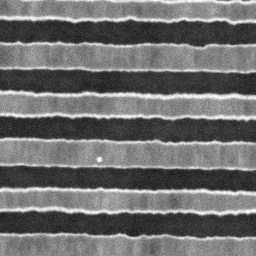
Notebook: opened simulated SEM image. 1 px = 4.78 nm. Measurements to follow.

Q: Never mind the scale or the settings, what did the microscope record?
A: lines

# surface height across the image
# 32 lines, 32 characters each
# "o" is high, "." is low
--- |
oooooooooooooooooooooooooooooooo
oooooooooooooooooooooooooooooooo
....o..ooooooooo.ooooooooooooooo
................................
................................
ooooooooo.ooo.....o.o...........
oooooooooooooooooooooooooooooooo
oooooooooooooooooooooooooooooooo
oooooooooooooooooooooooooooooooo
................................
................................
oo..............................
oooooooooooooooooooooooooooooooo
oooooooooooooooooooooooooooooooo
..oooo..oooooooooooooooooooooooo
................................
................................
oooooooo........................
oooooooooooooooooooooooooooooooo
oooooooooooooooooooooooooooooooo
oooooooooooooooooooooooooooooooo
................................
................................
....ooo.........................
oooooooooooooooooooooooooooooooo
oooooooooooooooooooooooooooooooo
........oooooooooooooooooooooooo
................................
................................
oooooooooooooooo..oooo..........
oooooooooooooooooooooooooooooooo
oooooooooooooooooooooooooooooooo